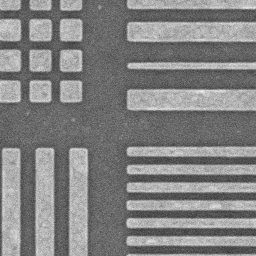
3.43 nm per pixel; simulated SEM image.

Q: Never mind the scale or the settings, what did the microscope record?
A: groups of lines, slits or small figures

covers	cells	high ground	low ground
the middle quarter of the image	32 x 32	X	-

XXXX------------XXXXXXXXXXXXXXXX
XXXX----------------------------
--------------------------------
--------------------------------
XXXX----------------------------
XXXX----------------------------
XXXX----------------------------
XXXX------------XXXXXXXXXXXXXXXX
XXXX------------XXXXXXXXXXXXXXXX
----------------XXX--XXXXXXXXXXX
----------------XXXXXXXXXXXXXXXX
--------------------------------
--------------------------------
--------------------------------
--------------------------------
--------------------------------
--------------------------------
--------------------------------
--------------------------------
--------------------------------
--------------------------------
--XXX-----------XXXXXXXXXXXXXXXX
--XXXX----------XXXXXXXXXXXXXXXX
--XXXX--------------------------
--XXXX--------------------------
--XXXX----------XXXXXXXXXXXXXXXX
---XXX----------XX-XXXXXXXXXXXXX
--XXXX--------------------------
--XXXX--------------------------
--XXXX--------------------------
--XXXX----------XXXXXXXXXXXXXXXX
--XXXX----------XXXXXXXXXXXXXXXX